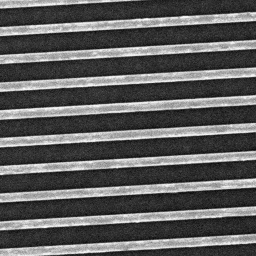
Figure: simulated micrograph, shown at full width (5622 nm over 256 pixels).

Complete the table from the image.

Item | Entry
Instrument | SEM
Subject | parallel lines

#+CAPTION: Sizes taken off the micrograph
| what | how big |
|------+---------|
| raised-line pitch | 608 nm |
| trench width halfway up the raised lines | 20 px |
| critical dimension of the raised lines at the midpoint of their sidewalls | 159 nm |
